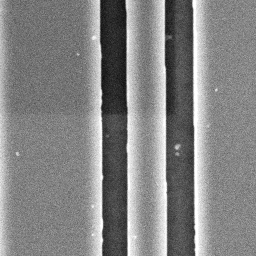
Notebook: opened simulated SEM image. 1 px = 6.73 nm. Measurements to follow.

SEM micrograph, lines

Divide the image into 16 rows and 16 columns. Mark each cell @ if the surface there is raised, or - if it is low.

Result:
@@@@@@--@@--@@@@
@@@@@@--@@--@@@@
@@@@@@--@@--@@@@
@@@@@@--@@--@@@@
@@@@@@--@@--@@@@
@@@@@@--@@--@@@@
@@@@@@--@@--@@@@
@@@@@@--@@--@@@@
@@@@@@--@@--@@@@
@@@@@@--@@--@@@@
@@@@@@--@@--@@@@
@@@@@@--@@--@@@@
@@@@@@--@@--@@@@
@@@@@@--@@--@@@@
@@@@@@--@@--@@@@
@@@@@@--@@--@@@@